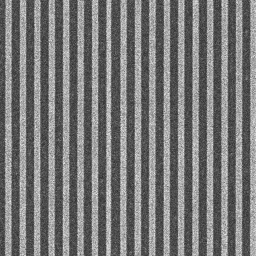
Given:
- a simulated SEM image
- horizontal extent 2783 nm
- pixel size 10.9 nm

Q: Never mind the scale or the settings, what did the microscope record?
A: parallel lines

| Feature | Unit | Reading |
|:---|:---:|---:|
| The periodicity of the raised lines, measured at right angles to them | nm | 157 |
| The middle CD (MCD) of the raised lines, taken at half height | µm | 0.0638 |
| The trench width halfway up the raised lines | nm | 93.7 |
